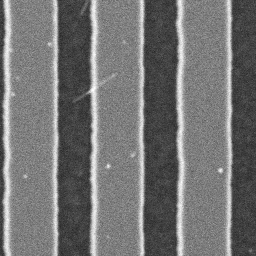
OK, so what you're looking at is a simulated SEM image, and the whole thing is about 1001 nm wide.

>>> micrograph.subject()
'lines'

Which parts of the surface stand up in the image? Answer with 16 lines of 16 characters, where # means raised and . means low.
####..###..###..
####..###..###..
####..###..###..
####..###..###..
####..###..###..
####..###..###..
####..###..###..
####..###..###..
####..###..###..
####..###..###..
####..###..###..
####..###..###..
####..###..###..
####..###..###..
####..###..###..
####..###..###..